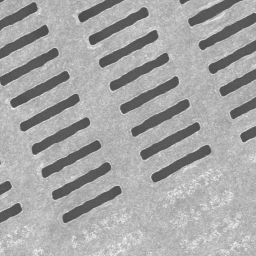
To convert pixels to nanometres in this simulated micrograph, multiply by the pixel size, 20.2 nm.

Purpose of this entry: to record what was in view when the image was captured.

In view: a regular array of holes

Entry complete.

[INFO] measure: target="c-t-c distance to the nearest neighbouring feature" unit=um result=0.506